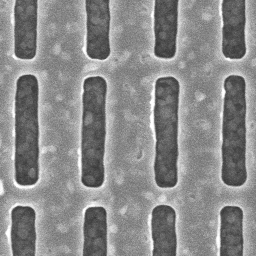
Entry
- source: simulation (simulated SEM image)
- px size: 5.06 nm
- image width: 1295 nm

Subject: holes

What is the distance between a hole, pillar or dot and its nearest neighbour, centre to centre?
343 nanometres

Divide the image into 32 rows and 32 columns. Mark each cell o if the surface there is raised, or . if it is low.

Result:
oo...oooooo...ooooo...oooooo...o
oo...oooooo...ooooo...oooooo...o
oo...oooooo...ooooo...oooooo...o
oo...oooooo...ooooo...oooooo...o
oo...oooooo...ooooo...oooooo...o
oo...oooooo...ooooo...oooooo...o
oo..ooooooo...ooooo...oooooo...o
oooooooooooooooooooooooooooooooo
oooooooooooooooooooooooooooooooo
ooo.ooooooooooooooooooooooooo.oo
oo...ooooo...oooooo...oooooo...o
oo...ooooo...oooooo...oooooo...o
oo...ooooo...oooooo...oooooo...o
oo...ooooo...oooooo...oooooo...o
oo...ooooo...oooooo...oooooo...o
oo...ooooo...oooooo...oooooo...o
oo...ooooo...oooooo...oooooo...o
oo...ooooo...oooooo...oooooo...o
oo...ooooo...oooooo...oooooo...o
oo...ooooo...oooooo...oooooo...o
oo...ooooo...oooooo...oooooo...o
oo...ooooo...oooooo...oooooo...o
oo...ooooo...oooooo...oooooo...o
oooooooooooooooooooo.ooooooooooo
oooooooooooooooooooooooooooooooo
oooooooooooooooooooooooooooooooo
o...ooooooo..oooooo...oooooo..oo
o...ooooooo..oooooo...oooooo..oo
o...oooooo...oooooo...ooooo...oo
o....ooooo...oooooo...ooooo...oo
o....ooooo...oooooo...ooooo...oo
oo..oooooo...oooooo...ooooo...oo